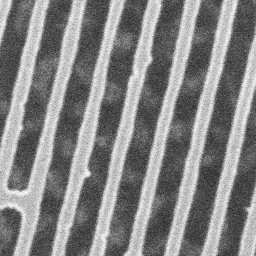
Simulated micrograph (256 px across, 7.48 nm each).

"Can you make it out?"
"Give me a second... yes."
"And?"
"parallel lines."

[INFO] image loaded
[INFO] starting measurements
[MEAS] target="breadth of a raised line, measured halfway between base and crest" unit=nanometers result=89.2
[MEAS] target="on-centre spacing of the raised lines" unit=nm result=274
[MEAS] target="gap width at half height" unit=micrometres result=0.185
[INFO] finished